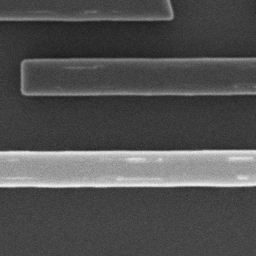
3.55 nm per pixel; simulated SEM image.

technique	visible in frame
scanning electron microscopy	wiring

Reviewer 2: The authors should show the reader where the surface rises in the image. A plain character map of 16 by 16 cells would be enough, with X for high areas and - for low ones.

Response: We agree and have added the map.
XXXXXXXXXXX-----
----------------
----------------
----------------
-XXXXXXXXXXXXXXX
-XXXXXXXXXXXXXXX
----------------
----------------
----------------
XX--XXXXXXXXXXXX
XXXXXXXXXXXXXXXX
XXXXXXXXXXXXXXXX
----------------
----------------
----------------
----------------